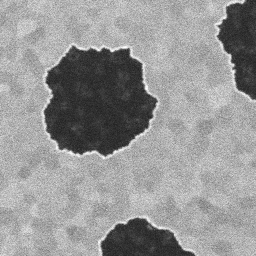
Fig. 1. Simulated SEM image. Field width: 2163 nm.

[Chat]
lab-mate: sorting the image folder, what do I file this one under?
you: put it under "holes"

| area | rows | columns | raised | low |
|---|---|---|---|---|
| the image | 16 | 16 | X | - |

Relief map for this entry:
XXXXXXXXXXXXXX--
XXXXXXXXXXXXXX--
XXXXXXXXXXXXXX--
XXXX----XXXXXX--
XXX------XXXXXX-
XXX------XXXXXX-
XXX-------XXXXXX
XXX------XXXXXXX
XXX------XXXXXXX
XXXX---XXXXXXXXX
XXXXXXXXXXXXXXXX
XXXXXXXXXXXXXXXX
XXXXXXXXXXXXXXXX
XXXXXXXXXXXXXXXX
XXXXXXX----XXXXX
XXXXXX------XXXX